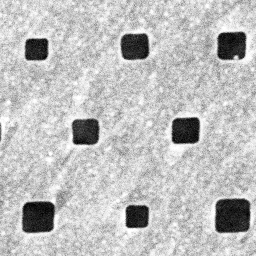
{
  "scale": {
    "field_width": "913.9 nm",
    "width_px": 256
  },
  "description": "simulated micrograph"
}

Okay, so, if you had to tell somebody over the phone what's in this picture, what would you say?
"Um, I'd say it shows a regular array of holes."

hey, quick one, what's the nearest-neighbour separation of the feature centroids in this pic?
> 343 nm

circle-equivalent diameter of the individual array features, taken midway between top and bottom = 109 nm